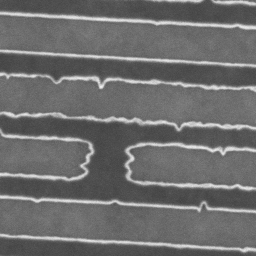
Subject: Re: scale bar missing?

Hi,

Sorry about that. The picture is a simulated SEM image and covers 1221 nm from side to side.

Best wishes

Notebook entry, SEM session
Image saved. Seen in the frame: one or a few lines or trenches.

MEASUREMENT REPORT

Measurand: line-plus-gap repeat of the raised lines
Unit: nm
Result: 293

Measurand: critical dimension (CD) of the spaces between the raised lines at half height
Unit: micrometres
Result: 0.18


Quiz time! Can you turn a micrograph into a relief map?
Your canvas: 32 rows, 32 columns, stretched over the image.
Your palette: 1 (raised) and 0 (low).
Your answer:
11111111111111111111111111111111
11111111111111111111111111111111
00000000000001111111111111111111
00000000000000000000000000000000
00000000000000000000000000000000
00000000000000000000000000000000
11100000000000000000000000000000
11111111111111111111000000000000
11111111111111111111111111111111
00010111111111111111111111111111
00000000000010000000001111111111
00000000000000000000000000000000
00000000000000000000000000000000
00000000000000000000000000000000
11111111000000000000000000000000
11111111111111111111110100000000
11111111111111111111111111111111
00000000011111111111111111111111
00000000000111111000000000111111
00000000000111110000000000000000
00000000001111110000000000000000
00000000000111110000000000000000
11111111111111110000000000000000
11111111111111111111111111111110
11111111111111111111111111111111
00000000000000011111111111111111
00000000000000000000000000000000
00000000000000000000000000000000
00000000000000000000000000000000
10000000000000000000000000000000
11111111111111111110000000000000
11111111111111111111111111111111